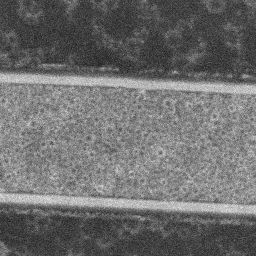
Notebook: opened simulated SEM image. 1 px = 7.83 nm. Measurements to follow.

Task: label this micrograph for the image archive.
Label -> one or a few lines or trenches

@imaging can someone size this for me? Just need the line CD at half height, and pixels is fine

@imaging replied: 121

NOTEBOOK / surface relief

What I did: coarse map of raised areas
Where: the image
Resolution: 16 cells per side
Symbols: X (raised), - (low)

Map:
----------------
----------------
----------------
----------------
----------------
XXXXXXXXXXXXXX--
XXXXXXXXXXXXXXXX
XXXXXXXXXXXXXXXX
XXXXXXXXXXXXXXXX
XXXXXXXXXXXXXXXX
XXXXXXXXXXXXXXXX
XXXXXXXXXXXXXXXX
---XXXXXXXXXXXXX
----------------
----------------
----------------